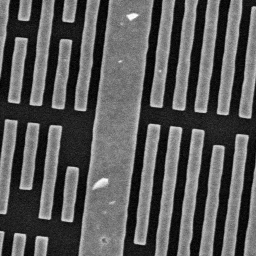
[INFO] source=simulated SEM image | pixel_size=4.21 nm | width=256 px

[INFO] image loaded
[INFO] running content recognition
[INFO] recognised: groups of lines, slits or small figures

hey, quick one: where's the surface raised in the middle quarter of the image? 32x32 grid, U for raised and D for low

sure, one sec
UDDDUUUDDUUUUUUUUUUUDDDUUUDDUUUD
UDDDUUUDDUUUUUUUUUUUDDDUUUDDUUUD
UDDDUUUDDUUUUUUUUUUUDDDUUUDDUUUD
UDDUUUDDDUUUUUUUUUUUDDUUUDDDUUUD
UDDUUUDDDUUUUUUUUUUUDDUUUDDDUUUD
DDDUUUDDDUUUUUUUUUUUDDUUUDDDUUUD
DDDUUUDDDUUUUUUUUUUUDDUUUDDDUUUD
DDDUUUDDDUUUUUUUUUUDDDUUUDDDUUDD
DDDUUUDDUUUUUUUUUUUDDDUUUDDUUUDD
DDDUUUDDUUUUUUUUUUUDDDUUUDDUUUDD
DDDUUUDDUUUUUUUUUUUDDDUUDDDUUUDD
DDDUUDDDUUUUUUUUUUUDDDDDDDDDDDDD
DDDDDDDDUUUUUUUUUUUDDDDDDDDDDDDD
DDDDDDDDUUUUUUUUUUUDDDDDDDDDDDDD
DDDDDDDDUUUUUUUUUUDDDDDDDDDDDDDD
DDDDDDDUUUUUUUUUUUDDDUUUDDDDDDDD
DDDDDDDUUUUUUUUUUUDDDUUUDDUUUDDD
DDDDDDDUUUUUUUUUUUDDDUUUDDUUUDDD
DDDDDDDUUUUUUUUUUUDDDUUUDDUUUDDD
DDDDDDDUUUUUUUUUUUDDDUUUDDUUUDDD
DDDDDDDUUUUUUUUUUUDDUUUDDDUUUDDD
DDDDDDDUUUUUUUUUUUDDUUUDDDUUUDDU
DDDDDDDUUUUUUUUUUUDDUUUDDDUUUDDU
DDDDDDDUUUUUUUUUUUDDUUUDDUUUUDDU
DDDDDDUUUUUUUUUUUDDDUUUDDUUUDDDU
DDDDDDUUUUUUUUUUUDDDUUUDDUUUDDDU
DUUDDDUUUUUUUUUUUDDDUUDDDUUUDDDU
UUUDDDUUUUUUUUUUUDDUUUDDDUUUDDDU
UUUDDDUUUUUUUUUUUDDUUUDDDUUUDDDU
UUUDDDUUUUUUUUUUUDDUUUDDDUUUDDDU
UUUDDDUUUUUUUUUUUDDUUUDDDUUUDDDU
UUUDDDUUUUUUUUUUDDDUUUDDDUUDDDUU